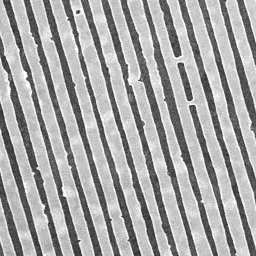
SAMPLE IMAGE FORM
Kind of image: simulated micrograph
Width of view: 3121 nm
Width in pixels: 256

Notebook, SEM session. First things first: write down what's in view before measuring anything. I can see parallel lines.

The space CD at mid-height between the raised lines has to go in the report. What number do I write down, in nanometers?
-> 91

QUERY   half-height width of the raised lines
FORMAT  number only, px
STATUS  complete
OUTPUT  11.6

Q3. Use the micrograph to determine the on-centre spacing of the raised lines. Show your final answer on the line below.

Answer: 228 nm